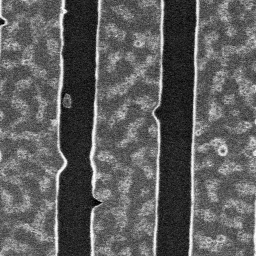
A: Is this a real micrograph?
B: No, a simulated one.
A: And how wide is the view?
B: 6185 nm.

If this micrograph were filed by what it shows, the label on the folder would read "one or a few lines or trenches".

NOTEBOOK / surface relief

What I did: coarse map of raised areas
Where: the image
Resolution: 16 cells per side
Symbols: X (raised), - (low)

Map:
XXXX--XXXX--XXXX
XXXX--XXXX--XXXX
XXXX--XXXX--XXXX
XXXX--XXXX--XXXX
XXXX--XXXX--XXXX
XXXX--XXXX--XXXX
XXXX--XXXX--XXXX
XXXX--XXXX--XXXX
XXXX--XXXX--XXXX
XXXX--XXXX--XXXX
XXXX--XXXX--XXXX
XXXX--XXXX--XXXX
XXXX--XXXX--XXXX
XXXX--XXXX--XXXX
XXXX--XXXX--XXXX
XXXX--XXXX--XXXX